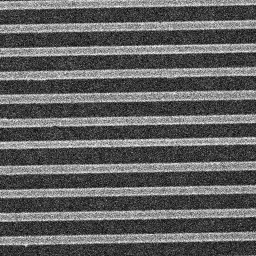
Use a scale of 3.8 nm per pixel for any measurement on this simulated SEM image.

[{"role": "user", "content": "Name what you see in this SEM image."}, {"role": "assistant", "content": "parallel lines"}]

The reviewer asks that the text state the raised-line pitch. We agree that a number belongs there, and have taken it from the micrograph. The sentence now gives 0.0894 micrometres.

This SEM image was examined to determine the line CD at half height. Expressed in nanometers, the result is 29.5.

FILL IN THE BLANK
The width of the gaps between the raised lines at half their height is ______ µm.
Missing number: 0.0589